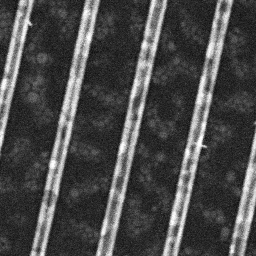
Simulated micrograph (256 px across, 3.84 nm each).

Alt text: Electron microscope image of one or a few lines or trenches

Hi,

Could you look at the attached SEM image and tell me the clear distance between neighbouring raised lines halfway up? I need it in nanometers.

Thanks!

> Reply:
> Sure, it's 209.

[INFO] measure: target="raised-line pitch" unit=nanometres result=249